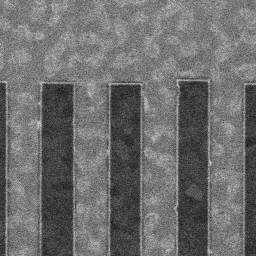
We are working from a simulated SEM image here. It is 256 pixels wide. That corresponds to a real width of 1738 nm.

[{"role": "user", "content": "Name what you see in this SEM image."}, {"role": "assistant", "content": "one or a few lines or trenches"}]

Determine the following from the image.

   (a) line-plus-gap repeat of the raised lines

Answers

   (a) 461 nm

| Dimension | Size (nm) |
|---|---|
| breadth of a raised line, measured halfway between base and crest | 215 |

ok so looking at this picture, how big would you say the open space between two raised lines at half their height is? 238 nanometres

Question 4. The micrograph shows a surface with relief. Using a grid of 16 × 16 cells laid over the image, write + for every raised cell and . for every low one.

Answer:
................
................
................
................
................
...++..++..++..+
...++..++..++..+
...++..++..++..+
...++..++..++..+
...++..++..++..+
...++..++..++..+
...++..++..++..+
...++..++..++..+
...++..++..++..+
...++..++..++..+
...++..++..++..+